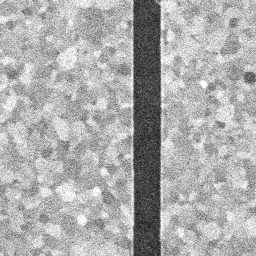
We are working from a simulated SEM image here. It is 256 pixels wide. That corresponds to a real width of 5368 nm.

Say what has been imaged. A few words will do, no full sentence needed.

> one or a few lines or trenches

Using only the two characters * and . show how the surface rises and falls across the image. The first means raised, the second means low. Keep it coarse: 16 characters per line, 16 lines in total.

********..******
********..******
********..******
********..******
********..******
********..******
********..******
********..******
********..******
********..******
********..******
********..******
********..******
********..******
********..******
********..******